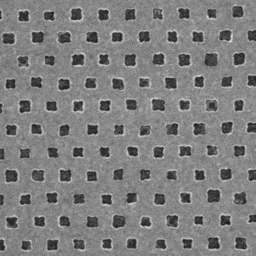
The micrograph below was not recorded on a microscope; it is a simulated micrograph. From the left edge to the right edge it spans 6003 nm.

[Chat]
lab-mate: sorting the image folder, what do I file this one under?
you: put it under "a regular array of holes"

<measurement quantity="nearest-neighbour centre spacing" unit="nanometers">599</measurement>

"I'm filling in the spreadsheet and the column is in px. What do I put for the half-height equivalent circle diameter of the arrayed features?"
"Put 11.7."